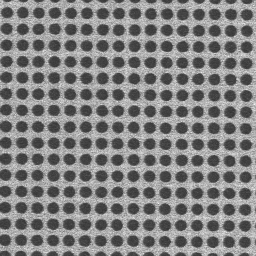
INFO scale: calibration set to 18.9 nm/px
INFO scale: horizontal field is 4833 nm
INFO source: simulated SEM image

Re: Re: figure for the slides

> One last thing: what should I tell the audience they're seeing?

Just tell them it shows a regular array of holes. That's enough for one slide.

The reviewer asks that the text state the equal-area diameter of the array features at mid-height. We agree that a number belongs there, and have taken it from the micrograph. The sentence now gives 223 nm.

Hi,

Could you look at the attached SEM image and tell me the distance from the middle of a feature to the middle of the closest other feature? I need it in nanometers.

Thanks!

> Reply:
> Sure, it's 299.